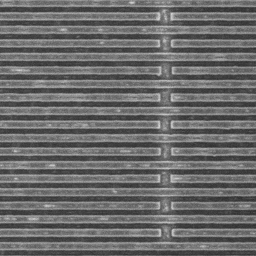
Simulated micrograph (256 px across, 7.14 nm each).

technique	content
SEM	parallel lines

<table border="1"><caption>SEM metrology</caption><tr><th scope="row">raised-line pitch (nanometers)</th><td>96.7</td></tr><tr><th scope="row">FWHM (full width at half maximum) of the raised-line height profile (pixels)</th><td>7.49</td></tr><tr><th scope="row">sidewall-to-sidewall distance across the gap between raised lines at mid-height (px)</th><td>6.5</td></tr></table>